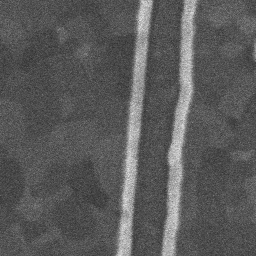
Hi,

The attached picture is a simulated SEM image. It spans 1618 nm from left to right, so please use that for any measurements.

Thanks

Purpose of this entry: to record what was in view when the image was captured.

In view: one or a few lines or trenches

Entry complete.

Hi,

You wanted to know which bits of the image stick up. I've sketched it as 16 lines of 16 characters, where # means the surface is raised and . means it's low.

#########...####
#########...####
#########...####
#########...####
#########...####
#########...####
########....####
########...#####
########...#####
########...#####
########...#####
########...#####
########...#####
########...#####
########...#####
########...#####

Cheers